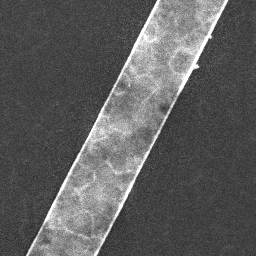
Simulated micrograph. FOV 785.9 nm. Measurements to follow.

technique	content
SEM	one or a few lines or trenches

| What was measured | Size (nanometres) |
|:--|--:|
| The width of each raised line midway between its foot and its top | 186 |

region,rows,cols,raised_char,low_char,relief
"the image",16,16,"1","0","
0000000000111100
0000000001111000
0000000001111000
0000000011110000
0000000011110000
0000000111100000
0000000111100000
0000001111000000
0000001111000000
0000011110000000
0000011110000000
0000111100000000
0001111100000000
0001111000000000
0011111000000000
0011110000000000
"